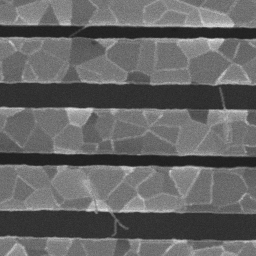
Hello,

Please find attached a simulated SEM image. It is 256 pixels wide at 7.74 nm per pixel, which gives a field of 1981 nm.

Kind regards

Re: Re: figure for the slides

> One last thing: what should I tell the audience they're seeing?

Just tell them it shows lines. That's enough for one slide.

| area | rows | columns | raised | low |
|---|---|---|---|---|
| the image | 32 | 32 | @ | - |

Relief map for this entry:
@@@@@@@@@@@@@@@@@@@@@@@@@@@@@@@@
@@@@@@@@@@@@@@@@@@@@@@@@@@@@@@@@
@@@@@@@@@@@@@@@@@@@@@@@@@@@@@@@@
--------------------------------
--------------------------------
@@@@@@@@@@@@@@@@@@@@@@@@@@@@@@@@
@@@@@@@@@@@@@@@@@@@@@@@@@@@@@@@@
@@@@@@@@@@@@@@@@@@@@@@@@@@@@@@@@
@@@@@@@@@@@@@@@@@@@@@@@@@@@@@@@@
@@@@@@@@@@@@@@@@@@@@@@@@@@@@@@@@
--------------@@@-@@@-@@@@@@-@@@
--------------------------------
--------------------------------
--------------------------------
@@@@@@@@@@@@@@@@@@@@@@@@@@@@@@@@
@@@@@@@@@@@@@@@@@@@@@@@@@@@@@@@@
@@@@@@@@@@@@@@@@@@@@@@@@@@@@@@@@
@@@@@@@@@@@@@@@@@@@@@@@@@@@@@@@@
@@@@@@@@@@@@@@@@@@@@@@@@@@@@@@@@
----------------------------@@@@
--------------------------------
@@@@@@@@@@@@@@@@@@@@@@@@@@@@@@@@
@@@@@@@@@@@@@@@@@@@@@@@@@@@@@@@@
@@@@@@@@@@@@@@@@@@@@@@@@@@@@@@@@
@@@@@@@@@@@@@@@@@@@@@@@@@@@@@@@@
@@@@@@@@@@@@@@@@@@@@@@@@@@@@@@@@
-------------@@---@@@@@@@@@@@@@@
--------------------------------
--------------------------------
--------------------------------
@@@@@@@@@@@@@@@@@@@@@@@@@@@@@@@@
@@@@@@@@@@@@@@@@@@@@@@@@@@@@@@@@